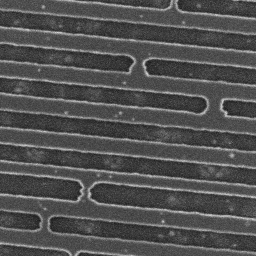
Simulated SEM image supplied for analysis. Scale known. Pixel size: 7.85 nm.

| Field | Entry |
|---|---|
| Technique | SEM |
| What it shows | parallel lines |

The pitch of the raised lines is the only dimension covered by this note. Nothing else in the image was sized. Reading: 261 nanometers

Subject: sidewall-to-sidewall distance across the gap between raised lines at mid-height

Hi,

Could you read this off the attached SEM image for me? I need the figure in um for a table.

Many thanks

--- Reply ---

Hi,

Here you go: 0.13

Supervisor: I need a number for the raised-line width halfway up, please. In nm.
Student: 130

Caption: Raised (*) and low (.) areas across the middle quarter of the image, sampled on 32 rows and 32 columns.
.................***............
*******.........****............
*********************...........
****************************....
********************************
........************************
..................**************
............................****
................................
******..........................
**************..................
***************************.....
********************************
.....***************************
...............*****************
........................********
................................
*...............................
***********.....................
*********************...........
********************************
.*******************************
............********************
......................**********
................................
................................
********........................
****************.*..............
**************************.*....
....****************************
....***...........**************
....**........................**